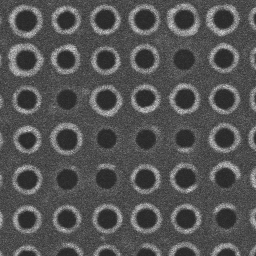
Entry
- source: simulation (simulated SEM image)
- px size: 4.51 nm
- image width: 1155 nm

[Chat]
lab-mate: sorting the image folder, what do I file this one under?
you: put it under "a regular array of holes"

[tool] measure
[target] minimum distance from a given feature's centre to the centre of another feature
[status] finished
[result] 177 nanometers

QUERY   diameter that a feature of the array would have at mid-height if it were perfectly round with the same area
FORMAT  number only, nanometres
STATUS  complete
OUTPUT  91.8